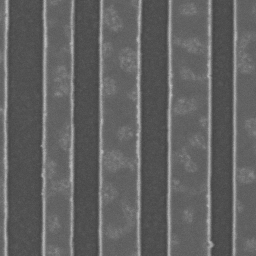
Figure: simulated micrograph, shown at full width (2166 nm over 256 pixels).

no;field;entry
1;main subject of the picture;one or a few lines or trenches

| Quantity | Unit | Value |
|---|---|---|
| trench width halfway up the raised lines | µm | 0.247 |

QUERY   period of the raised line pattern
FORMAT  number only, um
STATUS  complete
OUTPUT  0.557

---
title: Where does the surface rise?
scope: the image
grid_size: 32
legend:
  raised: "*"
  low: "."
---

*.....***....*****...*****...***
*.....***....*****...*****...***
*.....***....****....*****...***
*.....***....****....*****...***
*.....***....****....*****...***
*.....***....****....*****...***
*.....***....****....*****...***
*.....***....****....*****...***
*.....***....****....*****...***
*.....***....****....*****...***
*.....***....****....*****...***
*.....***....****....*****...***
*.....***....****....*****...***
*....****....****....*****...***
*....****....****....*****...***
*....****....****....*****...***
*....****....****....*****...***
*....****....****....*****...***
*....****....****....*****...***
*....****....****....*****...***
*....****....****....*****...***
*....****....****....*****...***
*....****....****....*****...***
*....****....****....*****...***
*....****....****....*****...***
*....****....****....*****...***
*.....***....****....*****...***
*.....***....****....*****...***
*.....***...*****....*****...***
*.....***....****....*****...***
*.....***....****....*****...***
*.....***....****....*****...***